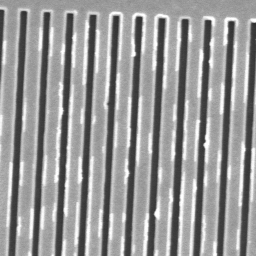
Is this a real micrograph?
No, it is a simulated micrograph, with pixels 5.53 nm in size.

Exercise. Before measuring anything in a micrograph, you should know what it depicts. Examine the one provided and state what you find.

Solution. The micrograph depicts parallel lines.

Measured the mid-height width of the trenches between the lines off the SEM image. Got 0.0435 micrometres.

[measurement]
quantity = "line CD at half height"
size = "80.7 nanometres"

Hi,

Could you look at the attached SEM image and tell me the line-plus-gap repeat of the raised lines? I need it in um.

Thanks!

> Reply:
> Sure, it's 0.128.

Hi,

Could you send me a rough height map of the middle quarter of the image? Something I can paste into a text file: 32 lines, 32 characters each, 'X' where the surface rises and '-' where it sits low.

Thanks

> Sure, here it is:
--XXX---XXX--XXXX--XXXX--XXXX--X
--XXX---XXX--XXXX--XXXX--XXX---X
--XXX---XXX--XXXX--XXXX--XXX---X
--XXX---XXX--XXXX--XXXX--XXX---X
--XXX---XXX--XXXX--XXX---XXX---X
--XXX---XXX--XXXX--XXX---XXX---X
--XXX---XXX--XXXX--XXX---XXX---X
--XXX--XXXX--XXXX--XXX---XXX---X
--XXX--XXXX--XXXX--XXX---XXX---X
--XXX--XXXX--XXXX--XXX---XXX--XX
--XXX--XXXX--XXXX--XXX---XXX--XX
-XXXX--XXX---XXXX--XXX---XXX--XX
-XXXX--XXX---XXX---XXX--XXXX--XX
-XXXX--XXX---XXX---XXX--XXXX--XX
-XXXX--XXX---XXX---XXX--XXXX--XX
-XXXX--XXX---XXX---XXX--XXXX--XX
-XXXX--XXX---XXXX-XXXX--XXXX--XX
-XXXX--XXX---XXX--XXXX--XXXX--XX
-XXXX--XXX---XXX--XXXX--XXXX--XX
-XXX---XXX---XXX--XXXX--XXXX--XX
-XXX---XXX---XXX--XXXX--XXXX--XX
-XXX---XXX---XXX--XXXX--XXX---XX
-XXX---XXX---XXX--XXXX--XXXX--XX
-XXX---XXX---XXX--XXXX--XXX---XX
-XXX---XXX--XXXX--XXX---XXX---XX
-XXX---XXX--XXXX--XXX---XXX---XX
-XXX---XXX--XXXX--XXX---XXX---XX
-XXX--XXXX--XXXX--XXX---XXX---XX
-XXXX-XXXX--XXXX--XXX---XXX---XX
XXXX--XXXX--XXXX--XXX---XXX--XXX
XXXX--XXXX--XXXX--XXX---XXX--XXX
XXXX--XXXX--XXXX--XXX---XXX--XXX